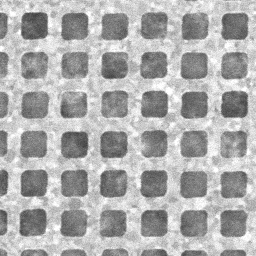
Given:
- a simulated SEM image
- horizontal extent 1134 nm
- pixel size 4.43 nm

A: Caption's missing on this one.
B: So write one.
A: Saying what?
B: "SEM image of a regular array of holes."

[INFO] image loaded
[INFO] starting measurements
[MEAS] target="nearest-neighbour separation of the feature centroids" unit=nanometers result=172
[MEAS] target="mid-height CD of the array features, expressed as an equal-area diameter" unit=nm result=134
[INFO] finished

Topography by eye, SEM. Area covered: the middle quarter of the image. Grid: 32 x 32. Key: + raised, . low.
......+++.......+++.......+++...
......+++.......+++.......+++...
......+++.......+++.......+++...
.....+++++.....+++++.....++++...
++++++++++++++++++++++++++++++++
++++++++++++++++++++++++++++++++
+++++++++++..+++++++++++++++++++
......+++.......++++......++++..
......+++.......+++.......+++...
......+++.......+++.......+++...
......+++.......+++.......+++...
......+++.......+++.......+++...
......+++.......+++.......+++...
.....+++++.....+++++.....+++++..
++++++++++++++++++++++++++++++++
++++++++++++++++++++++++++++++++
+++++++++++++++++++++....+++++++
......+++.......+++.......+++...
......+++.......+++.......+++...
......+++.......+++.......+++...
......+++.......+++.......+++...
......+++.......+++.......+++...
......+++.......+++.......+++...
.....+++++....++++++....+++++++.
++++++++++++++++++++++++++++++++
++++++++++++++++++++++++++++++++
.....++++++....+++++.....++++++.
......+++.......+++.......+++...
......+++.......+++.......+++...
......+++.......+++.......+++...
......+++.......+++.......+++...
......+++.......+++.......+++...